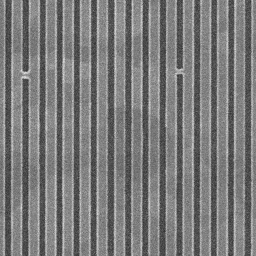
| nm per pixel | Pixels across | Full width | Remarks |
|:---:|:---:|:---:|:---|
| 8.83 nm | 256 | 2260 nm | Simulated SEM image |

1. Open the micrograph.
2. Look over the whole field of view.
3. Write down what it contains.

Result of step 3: parallel lines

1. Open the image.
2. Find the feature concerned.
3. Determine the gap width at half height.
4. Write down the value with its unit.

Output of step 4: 68.4 nanometres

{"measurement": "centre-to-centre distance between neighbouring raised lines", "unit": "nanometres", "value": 151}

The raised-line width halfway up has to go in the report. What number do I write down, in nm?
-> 86.1